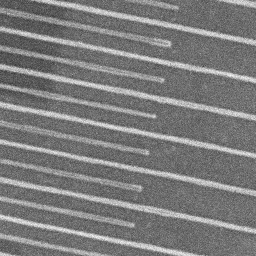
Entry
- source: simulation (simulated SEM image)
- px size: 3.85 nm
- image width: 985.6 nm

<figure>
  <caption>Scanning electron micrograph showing parallel lines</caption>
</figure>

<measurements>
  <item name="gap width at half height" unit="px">14.7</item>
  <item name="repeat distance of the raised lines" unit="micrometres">0.0711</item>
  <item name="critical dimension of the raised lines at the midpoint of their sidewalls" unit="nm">14.1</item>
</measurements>